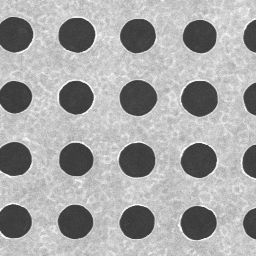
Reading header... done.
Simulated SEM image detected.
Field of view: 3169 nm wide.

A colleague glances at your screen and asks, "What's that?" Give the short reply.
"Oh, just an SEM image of a regular array of holes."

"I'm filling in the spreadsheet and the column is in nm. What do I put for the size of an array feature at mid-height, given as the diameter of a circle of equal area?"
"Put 437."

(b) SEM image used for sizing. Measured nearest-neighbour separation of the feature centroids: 61.5 pixels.